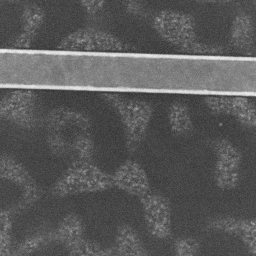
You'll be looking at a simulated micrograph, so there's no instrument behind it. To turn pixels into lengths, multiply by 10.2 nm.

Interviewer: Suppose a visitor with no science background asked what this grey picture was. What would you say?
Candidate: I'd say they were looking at one or a few lines or trenches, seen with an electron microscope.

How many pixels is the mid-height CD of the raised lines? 35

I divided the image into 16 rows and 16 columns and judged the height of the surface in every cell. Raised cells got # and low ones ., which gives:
................
................
................
#########.......
################
.....###########
................
................
................
................
................
................
................
................
................
................